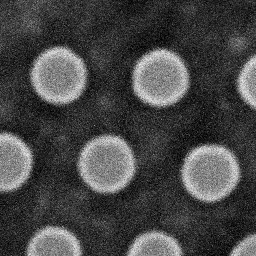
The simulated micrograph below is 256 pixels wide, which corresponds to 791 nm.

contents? raised bodies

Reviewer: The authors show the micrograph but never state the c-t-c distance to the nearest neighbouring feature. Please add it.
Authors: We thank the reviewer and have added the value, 312 nm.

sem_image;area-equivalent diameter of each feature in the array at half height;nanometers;166